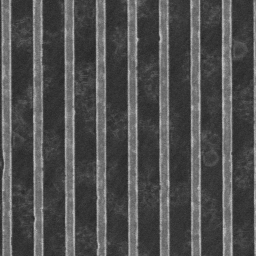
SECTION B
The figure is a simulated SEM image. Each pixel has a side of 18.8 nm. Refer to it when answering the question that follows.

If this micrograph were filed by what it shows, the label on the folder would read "parallel lines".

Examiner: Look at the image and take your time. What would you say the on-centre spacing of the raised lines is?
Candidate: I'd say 593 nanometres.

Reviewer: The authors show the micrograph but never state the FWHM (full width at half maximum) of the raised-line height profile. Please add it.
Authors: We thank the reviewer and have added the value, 148 nm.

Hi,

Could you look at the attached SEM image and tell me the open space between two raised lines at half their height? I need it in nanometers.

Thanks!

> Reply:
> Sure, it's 445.